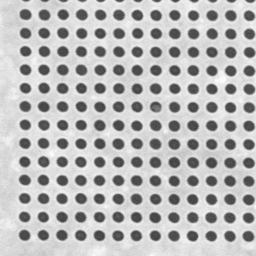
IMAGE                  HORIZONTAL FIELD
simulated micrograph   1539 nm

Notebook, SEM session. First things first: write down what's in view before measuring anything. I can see a regular array of holes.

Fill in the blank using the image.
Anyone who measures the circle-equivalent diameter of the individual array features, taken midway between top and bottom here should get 69.3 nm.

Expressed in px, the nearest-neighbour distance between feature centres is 18.1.